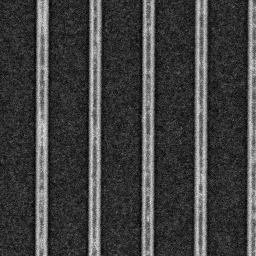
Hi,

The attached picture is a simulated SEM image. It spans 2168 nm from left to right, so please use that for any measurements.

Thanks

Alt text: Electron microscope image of parallel lines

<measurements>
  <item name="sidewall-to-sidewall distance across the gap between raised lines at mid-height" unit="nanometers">369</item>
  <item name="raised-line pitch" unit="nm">449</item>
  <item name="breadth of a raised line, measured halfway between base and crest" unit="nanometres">81.5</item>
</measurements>